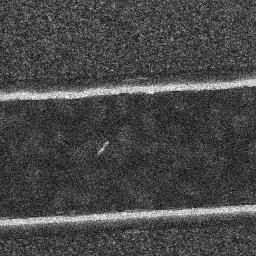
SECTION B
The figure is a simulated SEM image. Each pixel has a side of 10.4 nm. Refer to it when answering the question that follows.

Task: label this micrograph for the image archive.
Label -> one or a few lines or trenches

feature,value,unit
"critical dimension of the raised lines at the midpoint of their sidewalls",1310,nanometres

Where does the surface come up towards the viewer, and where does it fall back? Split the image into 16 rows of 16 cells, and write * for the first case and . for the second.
................
................
................
................
................
..........******
****************
****************
****************
****************
****************
****************
****************
********........
................
................